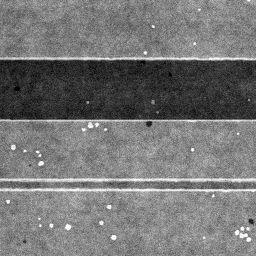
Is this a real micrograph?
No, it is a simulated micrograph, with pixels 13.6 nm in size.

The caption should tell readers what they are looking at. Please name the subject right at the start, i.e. lines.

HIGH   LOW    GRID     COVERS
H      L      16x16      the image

HHHHHHHHHHHHHHHH
HHHHHHHHHHHHHHHH
HHHHHHHHHHHHHHHH
HHHHHHHHHHHHHHHH
LLLLLLLLLLLLLLLL
LLLLLLLLLLLLLLLL
LLLLLLLLLLLLLLLL
LLLLLLLLLLLLLLLL
HHHHHHHHHHHHHHHH
HHHHHHHHHHHHHHHH
HHHHHHHHHHHHHHHH
HHHHHHHHHHHHHHHH
HHHHHHHHHHHHHHHH
HHHHHHHHHHHHHHHH
HHHHHHHHHHHHHHHH
HHHHHHHHHHHHHHHH